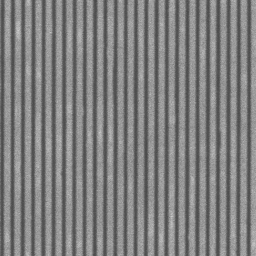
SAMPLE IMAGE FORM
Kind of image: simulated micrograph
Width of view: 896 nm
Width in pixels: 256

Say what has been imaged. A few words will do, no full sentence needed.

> parallel lines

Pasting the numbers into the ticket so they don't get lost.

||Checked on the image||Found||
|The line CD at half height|24.1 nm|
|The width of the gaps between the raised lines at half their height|0.0136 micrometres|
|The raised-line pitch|36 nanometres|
